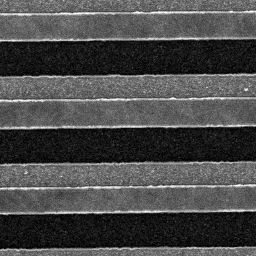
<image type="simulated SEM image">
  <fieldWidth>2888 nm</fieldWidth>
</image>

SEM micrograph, lines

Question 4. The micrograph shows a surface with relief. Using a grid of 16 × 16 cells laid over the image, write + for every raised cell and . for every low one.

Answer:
++++++++++++++++
++++++++++++++++
+++++++.........
................
................
++++++++++++++++
++++++++++++++++
++++++++++++++++
................
................
++++++++++++++++
++++++++++++++++
++++++++++++++++
................
................
...........+++++